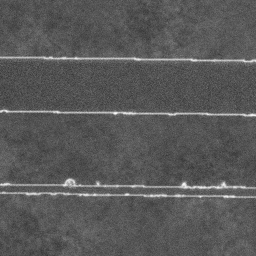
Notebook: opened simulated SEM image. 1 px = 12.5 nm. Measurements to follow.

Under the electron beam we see lines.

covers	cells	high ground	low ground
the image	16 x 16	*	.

................
................
................
................
****************
****************
****************
................
................
................
................
....*...........
................
................
................
................